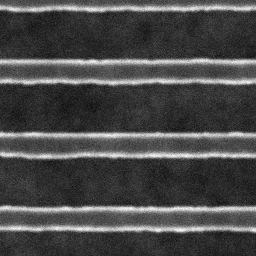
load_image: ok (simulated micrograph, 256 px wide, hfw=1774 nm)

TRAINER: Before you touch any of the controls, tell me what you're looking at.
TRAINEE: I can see lines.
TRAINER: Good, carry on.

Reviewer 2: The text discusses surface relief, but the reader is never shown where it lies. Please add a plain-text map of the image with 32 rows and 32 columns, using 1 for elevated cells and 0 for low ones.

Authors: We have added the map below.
11111111111111111111111111111111
00000000000000000000000000000000
00000000000000000000000000000000
00000000000000000000000000000000
00000000000000000000000000000000
00000000000000000000000000000000
00000000000000000000000000000000
00000000000000000000000011100000
11111111111111111111111111111111
11111111111111111111111111111111
00000000000001100000000000000000
00000000000000000000000000000000
00000000000000000000000000000000
00000000000000000000000000000000
00000000000000000000000000000000
00000000000000000000000000000000
00000000000000000000000000000000
11111111111111111111111111111111
11111111111111111111111111111111
00111111110000011111011111011111
00000000000000000000000000000000
00000000000000000000000000000000
00000000000000000000000000000000
00000000000000000000000000000000
00000000000000000000000000000000
00000000000000000000000000000000
11111111111111111111111111111111
11111111111111111111111111111111
11111111111111111111111111111111
00000000000000000000000000000000
00000000000000000000000000000000
00000000000000000000000000000000